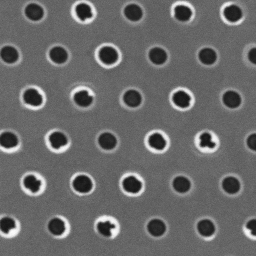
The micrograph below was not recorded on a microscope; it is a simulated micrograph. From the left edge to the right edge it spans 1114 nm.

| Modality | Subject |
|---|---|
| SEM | a regular array of holes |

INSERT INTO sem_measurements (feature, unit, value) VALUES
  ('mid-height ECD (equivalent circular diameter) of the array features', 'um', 0.0812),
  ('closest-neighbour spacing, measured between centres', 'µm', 0.214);